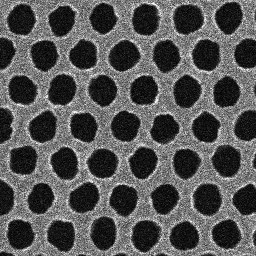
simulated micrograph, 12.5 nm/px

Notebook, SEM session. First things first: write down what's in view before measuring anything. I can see a regular array of holes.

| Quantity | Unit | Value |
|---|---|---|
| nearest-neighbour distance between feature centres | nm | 494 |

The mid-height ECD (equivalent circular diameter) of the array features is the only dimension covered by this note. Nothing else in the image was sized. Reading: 369 nm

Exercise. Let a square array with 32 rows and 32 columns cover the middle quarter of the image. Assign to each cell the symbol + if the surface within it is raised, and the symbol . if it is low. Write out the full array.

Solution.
+++....+++++......+++++.....++++
+++++++++++++...++++++++...+++++
+++++++++.++++++++++++++++++++++
..++++++....++++++....+++++++...
...++++......++++......+++++....
...+++.......++++......+++++....
...+++.......++++.......+++.....
...+++.......++++......++++.....
..+++++......++++......+++++....
..++++++....+++++.....++++++....
+++++++++..++++++++++++++++++...
++++++++++++++++++++++++++++++++
+++....++++++.....++++++...+++++
++......++++.......++++....+++++
++......++++.......+++......++++
+........+++.......+++.......+++
++......++++.......+++.......+++
++......++++......++++......++++
+++.....+++++.....++++......++++
++++...+++++++++++++++++..++++++
++++++++++++++++++++++++++++++++
..++++++....++++++....+++++++...
...++++......++++......+++++....
...+++.......+++.......++++.....
....++.......+++.......++++.....
....++.......+++.......++++.....
....++.......++++......+++++....
...++++.....+++++.....++++++....
..++++++..++++++++...++++++++..+
++++++++++++++++++++++++++++++++
++++....+++++...++++++++...+++++
+++.....++++......+++++.....++++